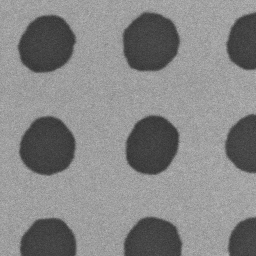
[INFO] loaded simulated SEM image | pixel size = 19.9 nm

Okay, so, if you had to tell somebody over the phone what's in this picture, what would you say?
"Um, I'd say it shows holes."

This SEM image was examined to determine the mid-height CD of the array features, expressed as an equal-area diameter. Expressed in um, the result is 1.13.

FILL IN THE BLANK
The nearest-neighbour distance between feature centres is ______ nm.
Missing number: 2040